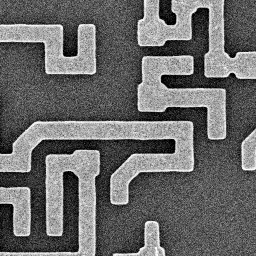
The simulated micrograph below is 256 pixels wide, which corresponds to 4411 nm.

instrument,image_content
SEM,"wiring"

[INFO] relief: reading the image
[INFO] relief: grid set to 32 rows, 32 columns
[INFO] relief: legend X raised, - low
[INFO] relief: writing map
------------------XX--XXXXXX----
------------------XX--XX--XX----
------------------XX--XX--XX----
XXXXXXXX--XX-----XXXXXXX--XX----
XXXXXXXX--XX-----XXXXXXX--XX----
-----XXX--XX-----XXX------XX----
------XX--XX--------------XX----
------XXXXXX------XXXXXX--XXXXXX
------XXXXXX------XXXXXX--XXXXXX
------------------XX------XX--XX
------------------XX------------
-----------------XXXXXXXXXXX----
-----------------XXXXXXXXXXX----
-----------------XXXX-----XX----
--------------------------XX----
----XXXXXXXXXXXXXXXXXXXX--XX----
---XXXXXXXXXXXXXXXXXXXXX--XX----
--XXX-----------------XX-------X
--XX------------------XX------XX
XXXX--XXXXXX----XXXXXXXX------XX
XXXX--XXXXXX---XXXXXXXXX------XX
------XX-XXX--XXXX--------------
------XX--XX--XX----------------
--X---XX--XX--XX----------------
XXXX--XX--XX--XX----------------
-XXX--XX--XX--------------------
--XX--XX--XX--------------------
--XX--XX--XX--------------------
--XX--XX--XX------XX------------
----------XX------XX------------
----------XX------XX------------
---------XXX-----XXXX-----------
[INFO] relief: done